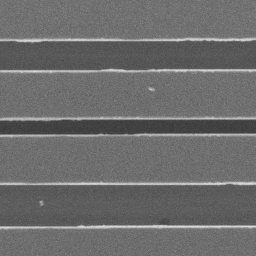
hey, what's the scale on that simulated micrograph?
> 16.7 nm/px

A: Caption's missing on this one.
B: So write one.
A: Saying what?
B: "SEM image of lines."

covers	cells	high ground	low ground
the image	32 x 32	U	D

UUUUUUUUUUUUUUUUUUUUUUUUUUUUUUUU
UUUUUUUUUUUUUUUUUUUUUUUUUUUUUUUU
UUUUUUUUUUUUUUUUUUUUUUUUUUUUUUUU
UUUUUUUUUUUUUUUUUUUUUUUUUUUUUUUU
UUUUUUUUUUUUUUUUUUUUUUUUUUUUUUUU
DDDDDDDDDDDDDDDDDDDDDDDDDDDDDDDD
DDDDDDDDDDDDDDDDDDDDDDDDDDDDDDDD
DDDDDDDDDDDDDDDDDDDDDDDDDDDDDDDD
DDDDDDDDDDDDDDDDDDDDDDDDDDDDDDDD
UUUUUUUUUUUUUUUUUUUUUUUUUUUUUUUU
UUUUUUUUUUUUUUUUUUUUUUUUUUUUUUUU
UUUUUUUUUUUUUUUUUUUUUUUUUUUUUUUU
UUUUUUUUUUUUUUUUUUUUUUUUUUUUUUUU
UUUUUUUUUUUUUUUUUUUUUUUUUUUUUUUU
UUUUUUUUUUUUUUUUUUUUUUUUUUUUUUUU
DDDDDDDDDDDDDDDDDDDDDDDDDDDDDDDD
DDDDDDDDDDDDDDDDDDDDDDDDDDDDDDDD
UUUUUUUUUUUUUUUUUUUUUUUUUUUUUUUU
UUUUUUUUUUUUUUUUUUUUUUUUUUUUUUUU
UUUUUUUUUUUUUUUUUUUUUUUUUUUUUUUU
UUUUUUUUUUUUUUUUUUUUUUUUUUUUUUUU
UUUUUUUUUUUUUUUUUUUUUUUUUUUUUUUU
UUUUUUUUUUUUUUUUUUUUUUUUUUUUUUUU
DDDDDDDDDDDDDDDDDDDDDDDDDDDDDDDD
DDDDDDDDDDDDDDDDDDDDDDDDDDDDDDDD
DDDDDDDDDDDDDDDDDDDDDDDDDDDDDDDD
DDDDDDDDDDDDDDDDDDDDDDDDDDDDDDDD
DDDDDDDDDDDDDDDDDDDDDDDDDDDDDDDD
UUUUUUUUUUUUUUUUUUUUUUUUUUUUUUUU
UUUUUUUUUUUUUUUUUUUUUUUUUUUUUUUU
UUUUUUUUUUUUUUUUUUUUUUUUUUUUUUUU
UUUUUUUUUUUUUUUUUUUUUUUUUUUUUUUU